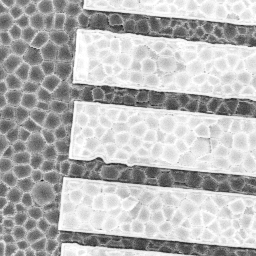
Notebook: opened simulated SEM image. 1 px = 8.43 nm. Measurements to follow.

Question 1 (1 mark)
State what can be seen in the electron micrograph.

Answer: one or a few lines or trenches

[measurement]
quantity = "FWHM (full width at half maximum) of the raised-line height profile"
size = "435 nm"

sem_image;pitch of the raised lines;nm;624